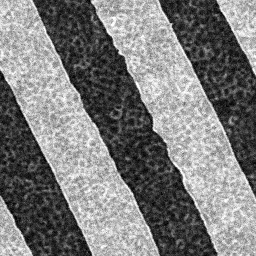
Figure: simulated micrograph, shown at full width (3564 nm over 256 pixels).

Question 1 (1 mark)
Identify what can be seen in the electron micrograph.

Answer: one or a few lines or trenches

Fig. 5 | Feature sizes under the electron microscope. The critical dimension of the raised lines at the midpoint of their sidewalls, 805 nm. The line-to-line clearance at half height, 760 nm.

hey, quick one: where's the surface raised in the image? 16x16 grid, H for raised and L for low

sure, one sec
HHLLLLHHHHLLLLHH
HHHLLLHHHHHLLLHH
HHHLLLLHHHHLLLLH
HHHHLLLLHHHHLLLH
HHHHLLLLHHHHLLLL
LHHHHLLLLHHHHLLL
LHHHHLLLLHHHHLLL
LLHHHHLLLLHHHHLL
LLHHHHLLLLHHHHLL
LLLHHHHLLLLHHHHL
LLLHHHHLLLLHHHHL
LLLLHHHHLLLLHHHH
LLLLHHHHLLLLHHHH
HLLLLHHHHLLLLHHH
HLLLLHHHHLLLLHHH
HHLLLLHHHHLLLHHH